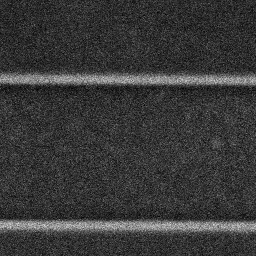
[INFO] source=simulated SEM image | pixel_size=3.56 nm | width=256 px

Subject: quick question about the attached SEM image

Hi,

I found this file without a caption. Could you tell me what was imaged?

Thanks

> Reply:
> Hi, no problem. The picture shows one or a few lines or trenches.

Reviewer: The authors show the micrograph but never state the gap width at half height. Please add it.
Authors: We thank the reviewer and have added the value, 521 nanometers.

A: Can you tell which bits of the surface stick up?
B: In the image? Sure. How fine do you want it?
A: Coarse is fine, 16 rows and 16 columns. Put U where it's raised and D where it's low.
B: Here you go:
UUUUUUUUUUUUUUUU
UUUUUUUUUUUUUUUU
UUUUUUUUUUUUUUUU
UUUUUUUUUUUUUUUU
UUUUUUUUUUUUUUUU
DDDDDDDDDDDDDDDD
DDDDDDDDDDDDDDDD
DDDDDDDDDDDDDDDD
DDDDDDDDDDDDDDDD
DDDDDDDDDDDDDDDD
DDDDDDDDDDDDDDDD
DDDDDDDDDDDDDDDD
DDDDDDDDDDDDDDDD
DDDDDDDDDDDDDDDD
UUUUUUUUUUUUUUUU
UUUUUUUUUUUUUUUU